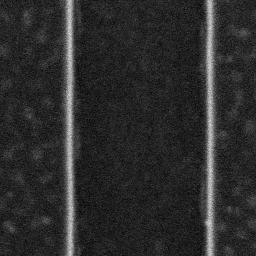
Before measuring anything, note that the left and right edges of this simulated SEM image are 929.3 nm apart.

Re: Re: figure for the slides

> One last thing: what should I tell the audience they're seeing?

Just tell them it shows one or a few lines or trenches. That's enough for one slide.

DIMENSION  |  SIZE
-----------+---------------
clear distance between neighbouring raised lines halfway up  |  507 nm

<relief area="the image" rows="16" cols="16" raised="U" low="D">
UUUUDDDDDDDDDUUU
UUUUDDDDDDDDDUUU
UUUUDDDDDDDDDUUU
UUUUDDDDDDDDDUUU
UUUUDDDDDDDDDUUU
UUUUDDDDDDDDDUUU
UUUUDDDDDDDDDUUU
UUUUDDDDDDDDDUUU
UUUUDDDDDDDDDUUU
UUUUDDDDDDDDDUUU
UUUUDDDDDDDDDUUU
UUUUDDDDDDDDDUUU
UUUUDDDDDDDDDUUU
UUUUDDDDDDDDDUUU
UUUUDDDDDDDDDUUU
UUUUDDDDDDDDDUUU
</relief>